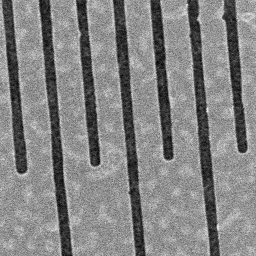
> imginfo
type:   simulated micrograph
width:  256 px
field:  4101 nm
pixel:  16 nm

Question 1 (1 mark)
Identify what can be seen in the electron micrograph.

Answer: parallel lines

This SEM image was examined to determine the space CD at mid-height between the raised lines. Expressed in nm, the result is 192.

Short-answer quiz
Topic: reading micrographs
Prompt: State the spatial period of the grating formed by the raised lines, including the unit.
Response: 0.591 um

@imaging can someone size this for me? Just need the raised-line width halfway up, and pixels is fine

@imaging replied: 24.9